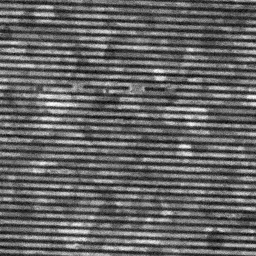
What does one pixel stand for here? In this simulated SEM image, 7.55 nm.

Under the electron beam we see parallel lines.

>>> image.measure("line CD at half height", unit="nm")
26.4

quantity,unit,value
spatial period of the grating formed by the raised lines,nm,56.2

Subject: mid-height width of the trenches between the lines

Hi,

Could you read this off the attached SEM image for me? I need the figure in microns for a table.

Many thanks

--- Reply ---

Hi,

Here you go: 0.0321